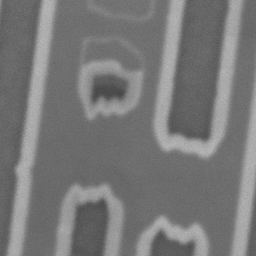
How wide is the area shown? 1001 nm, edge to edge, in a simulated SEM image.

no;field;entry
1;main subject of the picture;one or a few lines or trenches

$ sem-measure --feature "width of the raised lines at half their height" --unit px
46.6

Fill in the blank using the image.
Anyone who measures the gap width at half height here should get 223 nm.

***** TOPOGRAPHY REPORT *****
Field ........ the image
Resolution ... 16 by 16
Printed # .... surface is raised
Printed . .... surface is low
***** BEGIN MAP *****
...########....#
...########....#
...########...##
...########...##
..####..##....##
..###...##....##
..####..##....##
..########....##
..########....##
..##############
..##############
.##############.
.###...########.
.###...########.
.###...###.####.
.###...##....##.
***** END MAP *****